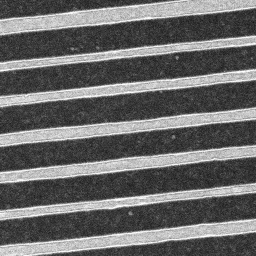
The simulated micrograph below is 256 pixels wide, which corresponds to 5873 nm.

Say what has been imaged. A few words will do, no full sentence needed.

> parallel lines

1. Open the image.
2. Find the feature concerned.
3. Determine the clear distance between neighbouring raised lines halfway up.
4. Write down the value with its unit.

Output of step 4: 211 nanometers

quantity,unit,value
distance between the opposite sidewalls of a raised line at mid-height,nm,656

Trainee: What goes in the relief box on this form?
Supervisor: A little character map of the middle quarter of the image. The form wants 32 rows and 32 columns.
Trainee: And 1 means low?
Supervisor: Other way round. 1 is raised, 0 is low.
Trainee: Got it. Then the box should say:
11111111111111111111111111111111
11111111111111111111111111111111
11111111111111111111111111111111
11111111111111111111111111111111
11111111111111111111100000000000
11111111111000000000000000000000
11100000000000000000001111111111
00000000000001111111111111111111
00011111111111111111111111111111
11111111111111111111111111111111
11111111111111111111111111111111
11111111111111111111111111111111
11111111111111111111111111111111
11111111111111111111111111000000
11111111111111110000000000000000
11111100000000000000000000000011
00000000000000000000011111111111
00000000000011111111111111111111
00011111111111111111111111111111
11111111111111111111111111111111
11111111111111111111111111111111
11111111111111111111111111111111
11111111111111111111111111110000
11111111111111111101111000000000
11111111100000000000010000000000
11000000000000000000000001111111
01100000000000011111111111111111
00000001111111111111111111111111
11111111111111111111111111111111
11111111111111111111111111111111
11111111111111111111111111111111
11111111111111111111111111111111